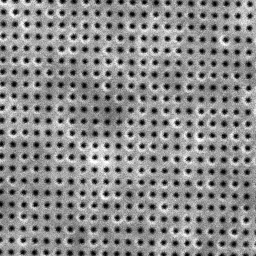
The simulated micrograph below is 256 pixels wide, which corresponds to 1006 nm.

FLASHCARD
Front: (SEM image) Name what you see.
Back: a regular array of holes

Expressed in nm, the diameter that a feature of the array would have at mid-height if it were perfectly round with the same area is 23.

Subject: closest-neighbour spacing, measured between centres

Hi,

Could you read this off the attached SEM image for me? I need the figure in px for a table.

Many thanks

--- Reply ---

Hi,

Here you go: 11.6